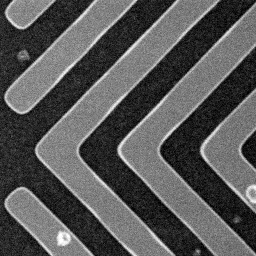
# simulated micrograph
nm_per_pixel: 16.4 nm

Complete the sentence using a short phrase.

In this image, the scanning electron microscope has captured groups of lines, slits or small figures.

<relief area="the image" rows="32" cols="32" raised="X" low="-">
-XXXXX-----XXXXXX-----XXXXX-----
-XXXX------XXXXX-----XXXXX-----X
-XXX------XXXXX-----XXXXX-----XX
--X------XXXXX-----XXXXX-----XXX
--------XXXXX-----XXXXX-----XXXX
-------XXXXX-----XXXXX-----XXXXX
------XXXXX-----XXXXX-----XXXXX-
-----XXXXX-----XXXXX-----XXXXX--
----XXXXX-----XXXXX-----XXXXX---
---XXXXX-----XXXXX-----XXXXX----
--XXXXX-----XXXXX-----XXXXX-----
-XXXXX-----XXXXX-----XXXXX------
-XXXX-----XXXXX-----XXXXX-----XX
-XXX-----XXXXX-----XXXXXX-----XX
--------XXXXX-----XXXXXX-----XXX
-------XXXXX-----XXXXX------XXXX
------XXXXX-----XXXXX------XXXXX
-----XXXXXX-----XXXXX-----XXXXX-
-----XXXXX-----XXXXX-----XXXXX--
-----XXXXX-----XXXXX-----XXXXX--
------XXXXX-----XXXXX-----XXXXX-
-------XXXXX-----XXXXX-----XXXXX
--------XXXXX-----XXXXX-----XXXX
--------XXXXXX-----XXXXX-----XXX
-XXX-----XXXXXX-----XXXXX-----XX
-XXXX------XXXXX-----XXXXX-----X
-XXXXX------XXXXX-----XXXXX-----
--XXXXX-----XXXXXX-----XXXXX----
---XXXXX-----XXXXXX-----XXXXX---
----XXXXX-----XXXXX------XXXXX--
-----XXXXX-----XXXXX------XXXXX-
------XXXXX-----XXXXX-----XXXXXX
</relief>